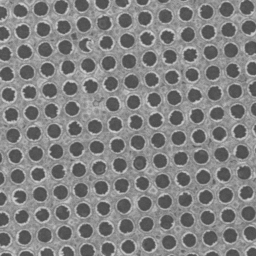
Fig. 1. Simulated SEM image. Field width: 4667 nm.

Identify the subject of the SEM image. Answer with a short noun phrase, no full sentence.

a regular array of holes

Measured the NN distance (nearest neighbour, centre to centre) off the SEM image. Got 366 nanometers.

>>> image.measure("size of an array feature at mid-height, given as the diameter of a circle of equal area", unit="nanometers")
256